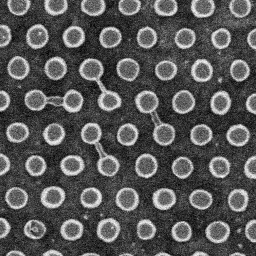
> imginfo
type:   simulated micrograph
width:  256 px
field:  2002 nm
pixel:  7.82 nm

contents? a regular array of raised bodies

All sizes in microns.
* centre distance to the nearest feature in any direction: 0.284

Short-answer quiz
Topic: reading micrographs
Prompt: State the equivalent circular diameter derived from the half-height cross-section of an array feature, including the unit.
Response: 0.158 microns